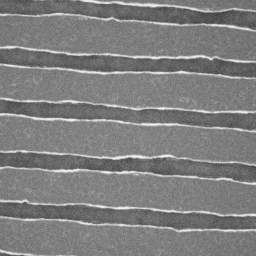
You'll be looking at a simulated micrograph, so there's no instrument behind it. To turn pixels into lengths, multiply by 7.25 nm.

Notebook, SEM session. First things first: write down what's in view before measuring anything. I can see parallel lines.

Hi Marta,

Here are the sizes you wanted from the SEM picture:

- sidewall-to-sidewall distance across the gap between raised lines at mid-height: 16.1 px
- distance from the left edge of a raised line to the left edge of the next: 369 nm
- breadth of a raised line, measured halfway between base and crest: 35 pixels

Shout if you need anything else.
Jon